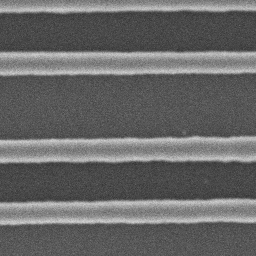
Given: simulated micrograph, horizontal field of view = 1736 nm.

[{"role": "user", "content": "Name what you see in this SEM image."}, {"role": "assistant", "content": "lines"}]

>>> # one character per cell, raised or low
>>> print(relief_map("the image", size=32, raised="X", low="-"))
XXXXXXXXXXXXXXXXXXXXXXXXXXXXXXXX
--------------------------------
--------------------------------
--------------------------------
--------------------------------
--------------------------------
--------------------------------
XXXXXXXXXXXXXXXXXXXXXXXXXXXXXXXX
XXXXXXXXXXXXXXXXXXXXXXXXXXXXXXXX
--------------------------------
--------------------------------
--------------------------------
--------------------------------
--------------------------------
--------------------------------
--------------------------------
--------------------------------
-----XXXXXXXXXXXXXXXXXXXXXXXXXXX
XXXXXXXXXXXXXXXXXXXXXXXXXXXXXXXX
XXXXXXXXXXXXXXXXXXXXXXXXXXXXXXXX
--------------------------------
--------------------------------
--------------------------------
--------------------------------
--------------------------------
XXXXXXXXXXXXXXXXXXXXXXXXXXXXXXXX
XXXXXXXXXXXXXXXXXXXXXXXXXXXXXXXX
XXXXXXXXXXXXXXXXXXXXXXXXXXXXXXXX
--------------------------------
--------------------------------
--------------------------------
--------------------------------